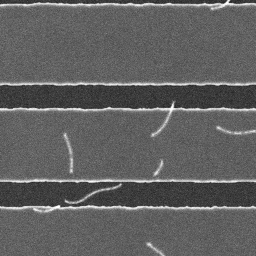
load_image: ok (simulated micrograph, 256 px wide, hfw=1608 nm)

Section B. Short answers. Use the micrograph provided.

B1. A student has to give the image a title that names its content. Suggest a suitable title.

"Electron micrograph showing lines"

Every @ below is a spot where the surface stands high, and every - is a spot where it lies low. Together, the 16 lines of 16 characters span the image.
@@@@@@@@@@@@@@@@
@@@@@@@@@@@@@@@@
@@@@@@@@@@@@@@@@
@@@@@@@@@@@@@@@@
@@@@@@@@@@@@@@@@
----------------
----------------
@@@@@@@@@@@@@@@@
@@@@@@@@@@@@@@@@
@@@@@@@@@@@@@@@@
@@@@@@@@@@@@@@@@
----------------
----------------
@@@@@@@@@@@@@@@@
@@@@@@@@@@@@@@@@
@@@@@@@@@@@@@@@@